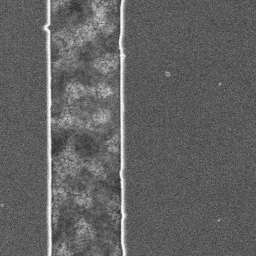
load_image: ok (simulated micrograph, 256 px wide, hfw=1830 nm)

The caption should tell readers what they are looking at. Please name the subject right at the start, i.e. one or a few lines or trenches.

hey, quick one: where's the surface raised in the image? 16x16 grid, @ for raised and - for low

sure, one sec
@@@-----@@@@@@@@
@@@-----@@@@@@@@
@@@-----@@@@@@@@
@@@-----@@@@@@@@
@@@-----@@@@@@@@
@@@-----@@@@@@@@
@@@-----@@@@@@@@
@@@-----@@@@@@@@
@@@-----@@@@@@@@
@@@-----@@@@@@@@
@@@-----@@@@@@@@
@@@-----@@@@@@@@
@@@-----@@@@@@@@
@@@-----@@@@@@@@
@@@-----@@@@@@@@
@@@-----@@@@@@@@